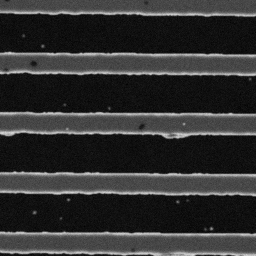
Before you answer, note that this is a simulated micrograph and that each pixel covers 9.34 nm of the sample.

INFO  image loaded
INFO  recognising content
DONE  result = lines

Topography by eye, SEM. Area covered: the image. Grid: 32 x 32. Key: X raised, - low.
XXXXXXXXXXXXXXXXXXXXXXXXXXXXXXXX
XXXXXXXXXXXXXXXXXXXXXXXXXXXXXXXX
--------------------------------
--------------------------------
--------------------------------
--------------------------------
--------------------------------
XXXXXXXXXXXXXXXXXXXXXXXXXXXXXXXX
XXXXXXXXXXXXXXXXXXXXXXXXXXXXXXXX
--------------------------------
--------------------------------
--------------------------------
--------------------------------
--------------------------------
XXXXXXXXXXXXXXXXXXXXXXXXXXXXXXXX
XXXXXXXXXXXXXXXXXXXXXXXXXXXXXXXX
XXXXXXXXXXXXXXXXXXXXXXXXXXXXXXXX
--------------------------------
--------------------------------
--------------------------------
--------------------------------
--------------------------------
XXXXXXXXXXXXXXXXXXXXXXXXXXXXXXXX
XXXXXXXXXXXXXXXXXXXXXXXXXXXXXXXX
--------------------------------
--------------------------------
--------------------------------
--------------------------------
--------------------------------
XXXXXXXXXXXXXXXXXXXXXXXXXXXXXXXX
XXXXXXXXXXXXXXXXXXXXXXXXXXXXXXXX
XXXXXXXXXXXXXXXXXXXXXXXXXXXXXXXX